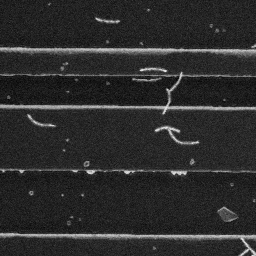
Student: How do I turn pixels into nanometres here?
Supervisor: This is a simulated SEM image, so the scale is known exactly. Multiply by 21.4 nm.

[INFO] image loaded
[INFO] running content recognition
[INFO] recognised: lines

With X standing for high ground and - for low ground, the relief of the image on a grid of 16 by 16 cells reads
----------------
----------------
----------------
XXXXXXXXXXXXXXXX
XXXXXXXXXXXXXXXX
----------------
----------------
XXXXXXXXXXXXXXXX
XXXXXXXXXXXXXXXX
XXXXXXXXXXXXXXXX
XXXXXXXXXXXXXXXX
----------------
----------------
----------------
----------------
XXXXXXXXXXXXXXXX